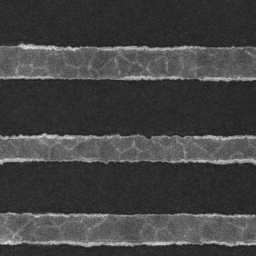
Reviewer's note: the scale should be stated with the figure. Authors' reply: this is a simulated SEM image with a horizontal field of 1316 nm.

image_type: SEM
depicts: one or a few lines or trenches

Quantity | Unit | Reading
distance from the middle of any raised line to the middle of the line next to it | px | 83.1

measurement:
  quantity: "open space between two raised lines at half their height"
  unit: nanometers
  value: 278